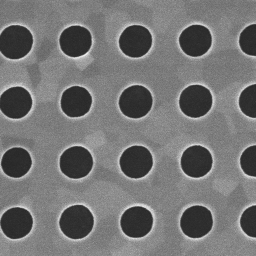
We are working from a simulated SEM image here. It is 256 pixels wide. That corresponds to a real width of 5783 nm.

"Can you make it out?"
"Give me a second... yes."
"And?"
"a regular array of holes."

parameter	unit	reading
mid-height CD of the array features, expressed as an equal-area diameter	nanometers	746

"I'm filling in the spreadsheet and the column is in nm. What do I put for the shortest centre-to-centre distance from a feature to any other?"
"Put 1350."